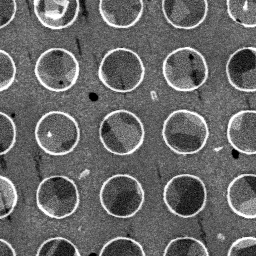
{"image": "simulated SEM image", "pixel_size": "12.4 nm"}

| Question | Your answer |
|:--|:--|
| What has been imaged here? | a regular array of raised bodies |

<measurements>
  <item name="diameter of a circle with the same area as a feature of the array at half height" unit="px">42.9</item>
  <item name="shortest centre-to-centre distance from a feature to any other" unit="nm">783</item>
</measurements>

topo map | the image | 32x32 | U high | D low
UUDDUUUUUUDDDUUUUUDDUUUUUUDDUUUU
UUDDDUUUUUDDDUUUUUDDDUUUUUDDDUUU
UDDDDUUUUDDDDUUUUDDDDUUUUDDDDUUU
DDDDDDDDDDDDDDDDDDDDDDDUDDDDDDDD
DDDDDDDDDDDDDDDDDDDDDDDDDDDDDDDD
DDDDDDDDDDDDDDDDDDDDDDDDDDDDDDDD
DDDDDDUUDDDDDDUUUDDDDDUUUDDDDDUU
UDDDDUUUUDDDDUUUUUDDDUUUUDDDDUUU
UUDDDUUUUUDDDUUUUUDDUUUUUUDDUUUU
UUDDDUUUUUDDDUUUUUDDDUUUUUDDDUUU
UDDDDUUUUDDDDUUUUDDDDUUUUDDDDUUU
DDDDDDDDDDDDDDDDDDDDDDDDDDDDDDDD
DDDDDDDDDDDDDDDDDDDDDDDDDDDDDDDD
DDDDDDDDDDDDDDDDDDDDDDDDDDDDDDDD
UDDDDDUUUDDDDDUUUDDDDUUUUDDDDUUU
UUDDDUUUUDDDDUUUUUDDDUUUUUDDDUUU
UUDDDUUUUUDDUUUUUUDDDUUUUUDDDUUU
UUDDDUUUUUDDDUUUUUDDDUUUUUDDDUUU
UDDDDUUUUDDDDUUUUDDDDUUUUDDDDDUU
DDDDDDDDDDDDDDDDDDDDDDDDDDDDDDDD
DDDDDDDDDDDDDDDDDDDDDDDDDDDDDDDD
DDDDDDDDDDDDDDDDDDDDDDDDDDDDDDDD
UDDDDDUUUDDDDDUUUDDDDDUUUDDDDUUU
UUDDDUUUUDDDDUUUUUDDDUUUUUDDDUUU
UUDDDUUUUUDDDUUUUUDDDUUUUUDDDUUU
UUDDDUUUUUDDDUUUUUDDDUUUUUDDDUUU
UDDDDDUUUDDDDDUUUDDDDDUUUDDDDDUU
DDDDDDDDDDDDDDDDDDDDDDDDDDDDDDDD
DDDDDDDDDDDDDDDDDDDDDDDDDDDDDDDD
DDDDDDDDDDDDDDDDDDDDDDDDDDDDDDDD
UDDDDUUUUDDDDUUUUDDDDUUUUDDDDUUU
UUDDDUUUUUDDDUUUUUDDDUUUUUDDDUUU